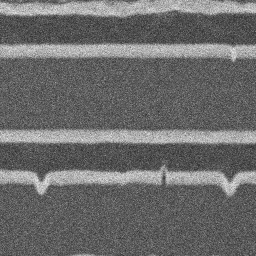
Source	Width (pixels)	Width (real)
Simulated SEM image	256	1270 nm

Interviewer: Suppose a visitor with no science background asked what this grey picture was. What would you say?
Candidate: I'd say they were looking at one or a few lines or trenches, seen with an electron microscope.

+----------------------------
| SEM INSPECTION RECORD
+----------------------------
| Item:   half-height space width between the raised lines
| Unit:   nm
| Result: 426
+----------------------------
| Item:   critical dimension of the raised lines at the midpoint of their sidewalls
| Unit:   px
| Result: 41.7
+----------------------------